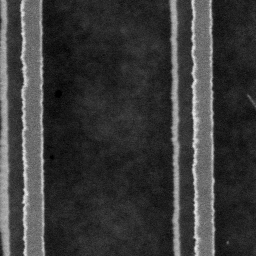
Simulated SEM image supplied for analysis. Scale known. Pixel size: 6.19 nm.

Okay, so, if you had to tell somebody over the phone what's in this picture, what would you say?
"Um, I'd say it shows lines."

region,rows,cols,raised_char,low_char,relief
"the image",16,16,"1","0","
1110000000011000
1110000000011000
1110000000011000
1110000000011000
1110000000011000
1110000000011000
1110000000011000
1110000000011000
1110000000011000
1110000000011000
1110000000011000
1110000000011000
1110000000011000
1110000000011000
1110000000011000
1110000000011000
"